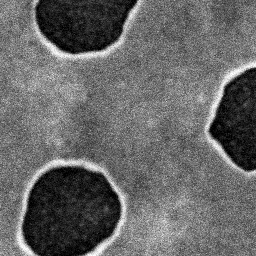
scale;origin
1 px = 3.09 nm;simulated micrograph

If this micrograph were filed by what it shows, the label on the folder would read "holes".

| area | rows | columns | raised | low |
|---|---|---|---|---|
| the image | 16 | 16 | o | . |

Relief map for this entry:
oo......oooooooo
oo......oooooooo
ooo....ooooooooo
oooooooooooooooo
ooooooooooooooo.
oooooooooooooo..
oooooooooooooo..
ooooooooooooo...
ooooooooooooo...
oooooooooooooo..
ooo...ooooooooo.
oo.....ooooooooo
oo......oooooooo
o.......oooooooo
o......ooooooooo
oo....oooooooooo